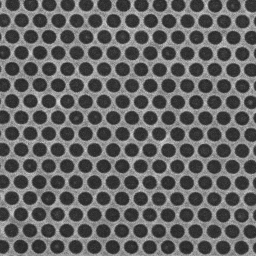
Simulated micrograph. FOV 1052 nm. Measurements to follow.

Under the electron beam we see a regular array of holes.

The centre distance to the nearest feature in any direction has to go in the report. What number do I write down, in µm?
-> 0.075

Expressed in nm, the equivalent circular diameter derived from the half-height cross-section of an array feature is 59.9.